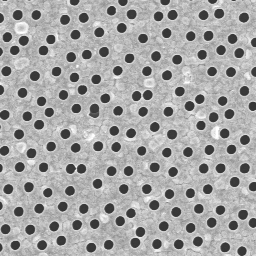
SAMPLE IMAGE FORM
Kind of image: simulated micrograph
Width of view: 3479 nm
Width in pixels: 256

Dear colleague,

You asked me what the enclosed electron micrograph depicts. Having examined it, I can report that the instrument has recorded a regular array of holes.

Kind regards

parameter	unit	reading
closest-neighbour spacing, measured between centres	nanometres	236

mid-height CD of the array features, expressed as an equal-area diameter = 135 nanometers